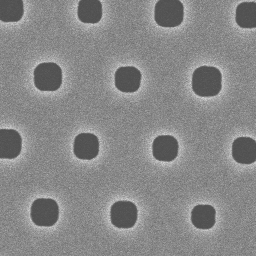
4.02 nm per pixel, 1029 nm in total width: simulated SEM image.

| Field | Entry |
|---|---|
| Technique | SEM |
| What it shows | a regular array of holes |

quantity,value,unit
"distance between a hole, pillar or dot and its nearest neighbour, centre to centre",0.314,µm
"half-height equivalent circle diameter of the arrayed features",27.8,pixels